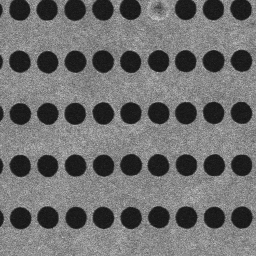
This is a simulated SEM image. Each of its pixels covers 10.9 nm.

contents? a regular array of holes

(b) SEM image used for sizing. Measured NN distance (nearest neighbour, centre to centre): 300 nm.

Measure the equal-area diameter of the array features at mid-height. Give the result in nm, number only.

239